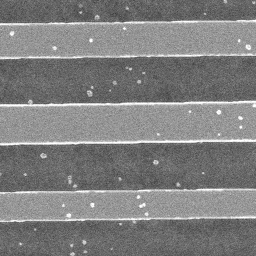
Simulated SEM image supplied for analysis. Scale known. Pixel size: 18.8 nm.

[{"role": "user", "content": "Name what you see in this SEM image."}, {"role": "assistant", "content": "lines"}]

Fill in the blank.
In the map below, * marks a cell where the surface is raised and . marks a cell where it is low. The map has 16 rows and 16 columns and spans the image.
................
...*************
****************
**********......
................
................
.......*********
****************
****************
................
................
................
****************
****************
................
................